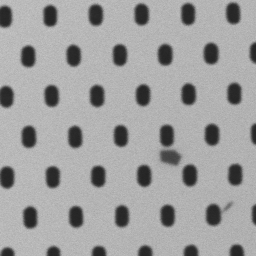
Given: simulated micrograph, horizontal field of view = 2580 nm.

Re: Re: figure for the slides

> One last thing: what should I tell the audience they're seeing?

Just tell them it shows a regular array of holes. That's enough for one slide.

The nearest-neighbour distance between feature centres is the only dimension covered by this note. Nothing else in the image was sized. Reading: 0.46 µm